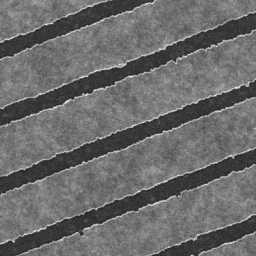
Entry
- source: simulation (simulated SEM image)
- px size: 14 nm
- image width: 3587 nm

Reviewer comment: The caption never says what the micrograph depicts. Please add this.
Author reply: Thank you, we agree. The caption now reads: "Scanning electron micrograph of one or a few lines or trenches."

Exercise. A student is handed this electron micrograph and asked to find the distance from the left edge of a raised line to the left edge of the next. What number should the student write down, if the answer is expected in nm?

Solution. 886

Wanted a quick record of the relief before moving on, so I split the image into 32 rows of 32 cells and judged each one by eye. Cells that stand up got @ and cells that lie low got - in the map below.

@@@@@@@@@@@@------@@@@@@@@@@@@@@
@@@@@@@@@@------@@@@@@@@@@@@@@@@
@@@@@@@------@@@@@@@@@@@@@@@@---
@@@@@-----@@@@@@@@@@@@@@@@@-----
@@------@@@@@@@@@@@@@@@@------@@
-----@@@@@@@@@@@@@@@@------@@@@@
---@@@@@@@@@@@@@@@@-----@@@@@@@@
@@@@@@@@@@@@@@@@@-----@@@@@@@@@@
@@@@@@@@@@@@@@------@@@@@@@@@@@@
@@@@@@@@@@@------@@@@@@@@@@@@@@@
@@@@@@@@------@@@@@@@@@@@@@@@@@-
@@@@@@------@@@@@@@@@@@@@@@@----
@@@------@@@@@@@@@@@@@@@@------@
-------@@@@@@@@@@@@@@@@-----@@@@
----@@@@@@@@@@@@@@@@------@@@@@@
-@@@@@@@@@@@@@@@@------@@@@@@@@@
@@@@@@@@@@@@@@@------@@@@@@@@@@@
@@@@@@@@@@@@------@@@@@@@@@@@@@@
@@@@@@@@@@------@@@@@@@@@@@@@@@@
@@@@@@@------@@@@@@@@@@@@@@@@---
@@@@------@@@@@@@@@@@@@@@@@-----
@@-----@@@@@@@@@@@@@@@@@-----@@@
-----@@@@@@@@@@@@@@@@------@@@@@
--@@@@@@@@@@@@@@@@@------@@@@@@@
@@@@@@@@@@@@@@@@------@@@@@@@@@@
@@@@@@@@@@@@@------@@@@@@@@@@@@@
@@@@@@@@@@@-----@@@@@@@@@@@@@@@@
@@@@@@@@------@@@@@@@@@@@@@@@@@-
@@@@@@-----@@@@@@@@@@@@@@@@@----
@@@------@@@@@@@@@@@@@@@@------@
------@@@@@@@@@@@@@@@@------@@@@
---@@@@@@@@@@@@@@@@@------@@@@@@